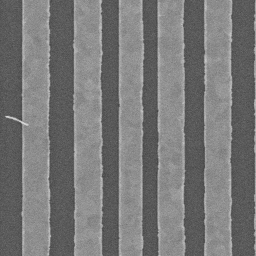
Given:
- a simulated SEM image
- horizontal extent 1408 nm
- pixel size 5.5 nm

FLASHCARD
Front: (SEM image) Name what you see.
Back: lines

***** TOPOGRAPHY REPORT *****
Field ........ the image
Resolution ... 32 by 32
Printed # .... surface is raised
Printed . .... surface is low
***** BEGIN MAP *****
...###...####..###..###...###...
...###...####..###..###...###...
...###...####..###..###...###...
...###...####..###..###...###...
...###...####..###..###...###...
...###...####..###..###...###...
...###...####..###..###...###...
...###...####..###..###...###...
...###...####..###..###...###...
...###...####..###..###...###...
...###...####..###..###...###...
...###...####..###..###...###...
...###...####..###..###...###...
...###...####..###..###...###...
...###...####..###..###...###...
...###...####..###..###...###...
...###...####..###..###...###...
...###...####..###..###...###...
...###...####..###..###...###...
...###...####..###..###...###...
...###...####..###..###...###...
...###...####..###..###...###...
...###...####..###..###...###...
...###...####..###..###...###...
...###...####..###..###...###...
...###...####..###..###...###...
...###...####..###..###...###...
...###...####..###..###...###...
...###...####..###..###...###...
...###...####..###..###...###...
...###...####..###..###...###...
...###...####..###..###...###...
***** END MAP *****